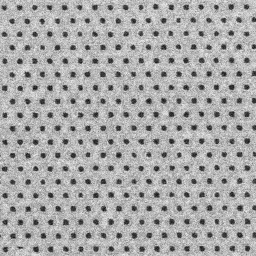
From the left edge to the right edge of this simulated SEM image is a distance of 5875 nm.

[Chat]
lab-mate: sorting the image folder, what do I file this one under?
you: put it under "a regular array of holes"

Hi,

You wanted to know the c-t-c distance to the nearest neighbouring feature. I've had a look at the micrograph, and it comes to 339 nanometres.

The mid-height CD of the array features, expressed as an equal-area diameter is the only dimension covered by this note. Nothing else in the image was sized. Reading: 149 nanometers